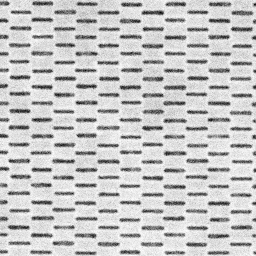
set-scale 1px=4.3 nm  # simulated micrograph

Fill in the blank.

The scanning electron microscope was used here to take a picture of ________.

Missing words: a regular array of holes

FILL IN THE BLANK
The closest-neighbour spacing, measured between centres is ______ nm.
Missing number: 69.5